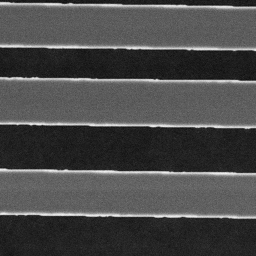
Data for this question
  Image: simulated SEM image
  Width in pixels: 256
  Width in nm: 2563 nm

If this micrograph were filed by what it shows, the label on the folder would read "lines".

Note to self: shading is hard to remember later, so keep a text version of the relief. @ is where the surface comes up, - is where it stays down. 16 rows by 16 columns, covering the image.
@@@@@@@@@@@@@@@@
@@@@@@@@@@@@@@@@
@@@@@@@@@@@@@@@@
----------------
----------------
@@@@@@@@@@@@@@@@
@@@@@@@@@@@@@@@@
@@@@@@@@@@@@@@@@
----------------
----------------
----------------
@@@@@@@@@@@@@@@@
@@@@@@@@@@@@@@@@
-----@@@@@@@@@@@
----------------
----------------